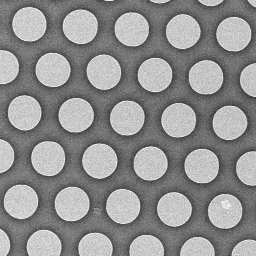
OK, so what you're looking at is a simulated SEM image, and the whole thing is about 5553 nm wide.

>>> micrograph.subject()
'an array of small figures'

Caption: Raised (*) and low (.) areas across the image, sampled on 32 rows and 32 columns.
.........................**....*
..***....**.....................
..****..****...***...***....**..
..****..****..*****..****..****.
..***...****...***...****..****.
................**...***....***.
*...............................
**...***...***....**............
**...****..****..****...***....*
**...****..****..****...****..**
.....***....***...***...****..**
.........................**....*
..**.....*......................
.****...***...****...***....**..
.****..*****..****..****...****.
..***...***...****..****...****.
...............**....***...***..
................................
*...****...***....**............
**..****..*****..****...***...**
*...****..*****..****..****...**
.....**....***...****..****...**
..................*.....**....**
.***....**......................
.****..****...***....**....**...
.****..****..****...****..****..
.***...****..****...****..****..
........**....***...***...****..
................................
*...***....**.....*.............
*..*****..****..****...***....**
*..*****..****..****...****..***